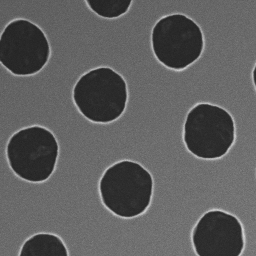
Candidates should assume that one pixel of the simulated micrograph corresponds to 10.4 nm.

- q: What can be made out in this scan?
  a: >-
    holes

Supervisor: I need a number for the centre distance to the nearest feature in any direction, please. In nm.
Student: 965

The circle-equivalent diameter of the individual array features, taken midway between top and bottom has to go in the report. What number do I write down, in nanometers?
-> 544